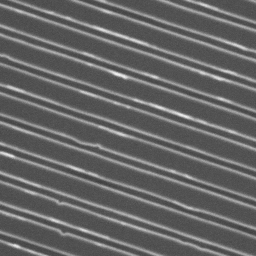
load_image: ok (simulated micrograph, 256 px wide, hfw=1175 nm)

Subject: parallel lines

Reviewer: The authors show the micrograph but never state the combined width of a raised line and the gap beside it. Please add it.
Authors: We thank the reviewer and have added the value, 128 nm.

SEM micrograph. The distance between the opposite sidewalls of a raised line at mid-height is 0.0963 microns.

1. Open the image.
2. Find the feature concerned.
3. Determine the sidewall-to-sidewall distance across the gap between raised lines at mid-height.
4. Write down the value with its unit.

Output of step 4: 29.3 nanometers